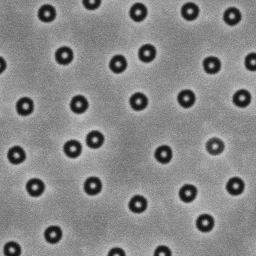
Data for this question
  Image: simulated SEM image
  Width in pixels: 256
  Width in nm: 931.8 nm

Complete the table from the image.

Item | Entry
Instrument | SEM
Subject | a regular array of ring-shaped grooves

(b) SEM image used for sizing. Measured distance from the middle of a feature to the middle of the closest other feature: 0.153 um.